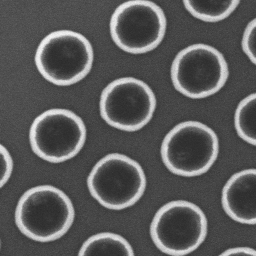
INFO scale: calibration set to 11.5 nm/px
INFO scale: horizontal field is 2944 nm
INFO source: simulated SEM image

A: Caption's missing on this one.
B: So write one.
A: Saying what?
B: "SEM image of a regular array of raised bodies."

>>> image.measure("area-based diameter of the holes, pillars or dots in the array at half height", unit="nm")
594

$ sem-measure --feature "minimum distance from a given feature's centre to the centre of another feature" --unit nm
879